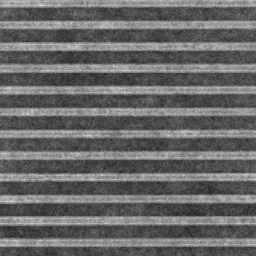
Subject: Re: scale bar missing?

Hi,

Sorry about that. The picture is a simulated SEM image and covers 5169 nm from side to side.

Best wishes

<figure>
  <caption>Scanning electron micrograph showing parallel lines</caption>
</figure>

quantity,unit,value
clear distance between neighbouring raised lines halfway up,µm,0.313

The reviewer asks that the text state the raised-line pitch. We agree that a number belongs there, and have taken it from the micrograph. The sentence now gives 439 nanometers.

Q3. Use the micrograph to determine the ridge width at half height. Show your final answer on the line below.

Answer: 139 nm